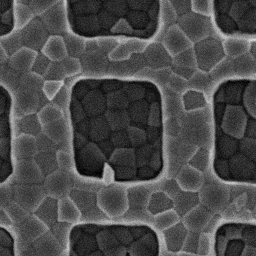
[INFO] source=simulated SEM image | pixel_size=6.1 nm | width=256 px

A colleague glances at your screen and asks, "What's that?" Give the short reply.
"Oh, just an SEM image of holes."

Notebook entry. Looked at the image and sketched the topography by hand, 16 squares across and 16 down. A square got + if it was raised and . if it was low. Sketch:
.+++......+++...
.+++......++++..
++++++++++++++++
++++++++++++++++
++++++++++++++++
+++++.....++++..
.+++......+++...
.+++......+++...
.+++......+++...
.++++.....+++...
.++++.....+++...
++++++++++++++++
++++++++++++++++
++++++++++++++++
++++......++++..
.+++......+++...